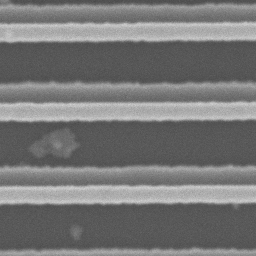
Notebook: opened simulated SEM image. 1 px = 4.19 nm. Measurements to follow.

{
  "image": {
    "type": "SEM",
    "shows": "lines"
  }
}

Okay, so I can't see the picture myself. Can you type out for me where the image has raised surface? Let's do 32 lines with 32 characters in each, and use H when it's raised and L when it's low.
LLLLLLLLLLLLLLLLLLLLLLLLLLLLLLLL
HHHHHHHHHHHHHHHHHHHHHHHHHHHHHHHH
HHHHHHHHHHHHHHHHHHHHHHHHHHHHHHHH
HHHHHHHHHHHHHHHHHHHHHHHHHHHHHHHH
HHHHHHHHHHHHHHHHHHHHHHHHHHHHHHHH
LLLLLLLLLLLLLLLLLLLLLLLLLLLLLLLL
LLLLLLLLLLLLLLLLLLLLLLLLLLLLLLLL
LLLLLLLLLLLLLLLLLLLLLLLLLLLLLLLL
LLLLLLLLLLLLLLLLLLLLLLLLLLLLLLLL
LLLLLLLLLLLLLLLLLLLLLLLLLLLLLLLL
LLLLLLLLLLLLLLLLLLLLLLLLLLLLLLLL
HHHHHHHHHHHHHHHHHHHHHHHHHHHHHHHH
HHHHHHHHHHHHHHHHHHHHHHHHHHHHHHHH
HHHHHHHHHHHHHHHHHHHHHHHHHHHHHHHH
HHHHHHHHHHHHHHHHHHHHHHHHHHHHHHHH
LLLLLLLLLLLLLLLLLLLLLLLLLLLLLLLL
LLLLLLLLLLLLLLLLLLLLLLLLLLLLLLLL
LLLLLLLLLLLLLLLLLLLLLLLLLLLLLLLL
LLLLLLLLLLLLLLLLLLLLLLLLLLLLLLLL
LLLLLLLLLLLLLLLLLLLLLLLLLLLLLLLL
LLLLLLLLLLLLLLLLLLLLLLLLLLLLLLLL
HHHHHHHHHHHHHHHHHHHHHHHHHHHHHHHH
HHHHHHHHHHHHHHHHHHHHHHHHHHHHHHHH
HHHHHHHHHHHHHHHHHHHHHHHHHHHHHHHH
HHHHHHHHHHHHHHHHHHHHHHHHHHHHHHHH
LLLLLLLLLLLLLLLLLLLLLLLLLLLLLLLL
LLLLLLLLLLLLLLLLLLLLLLLLLLLLLLLL
LLLLLLLLLLLLLLLLLLLLLLLLLLLLLLLL
LLLLLLLLLLLLLLLLLLLLLLLLLLLLLLLL
LLLLLLLLLLLLLLLLLLLLLLLLLLLLLLLL
LLLLLLLLLLLLLLLLLLLLLLLLLLLLLLLL
LLLLLLLHHHLHHHHHHHLHHHHHHHHHHHHH